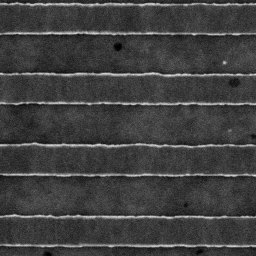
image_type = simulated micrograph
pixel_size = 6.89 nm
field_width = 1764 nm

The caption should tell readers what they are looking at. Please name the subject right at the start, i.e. lines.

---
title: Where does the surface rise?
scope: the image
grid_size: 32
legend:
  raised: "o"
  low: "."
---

ooo.oo.ooo..ooooo.oo....oo..o..o
oooooooooooooooooooooooooooooooo
oooooooooooooooooooooooooooooooo
oooooooooooooooooooooooooooooooo
................................
................................
................................
................................
................................
oooooooooooooooooooooooooooooooo
oooooooooooooooooooooooooooooooo
oooooooooooooooooooooooooooooooo
oooooooooooooooooooooooooooooooo
................................
................................
................................
................................
................................
oooooooooooooooooooooooooooooooo
oooooooooooooooooooooooooooooooo
oooooooooooooooooooooooooooooooo
oooooooooooooooooooooooooooooooo
................................
................................
................................
................................
................................
oooooooooooooooooooooooooooooooo
oooooooooooooooooooooooooooooooo
oooooooooooooooooooooooooooooooo
oooooooooooooooooooooooooooooooo
................................